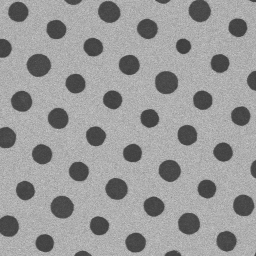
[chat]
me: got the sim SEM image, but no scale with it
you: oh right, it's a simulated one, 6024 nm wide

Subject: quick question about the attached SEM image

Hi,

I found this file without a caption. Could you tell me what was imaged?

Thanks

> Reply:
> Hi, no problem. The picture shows a regular array of holes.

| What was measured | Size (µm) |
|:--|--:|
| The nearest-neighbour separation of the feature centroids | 0.927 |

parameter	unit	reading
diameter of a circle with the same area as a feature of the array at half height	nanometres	468